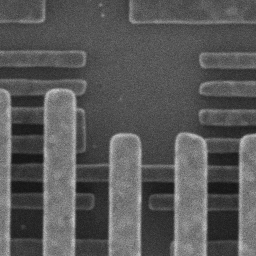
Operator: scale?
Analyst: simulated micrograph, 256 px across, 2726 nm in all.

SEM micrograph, wiring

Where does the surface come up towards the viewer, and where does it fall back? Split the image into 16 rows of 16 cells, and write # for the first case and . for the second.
................
................
................
................
................
................
#..##...........
#..##...........
#..##..#...#...#
#..##..##..##..#
#..##..##..##..#
#..##..##..##..#
#..##..##..##..#
#..##..##..##..#
#..##..##..##..#
#..##..##..##..#